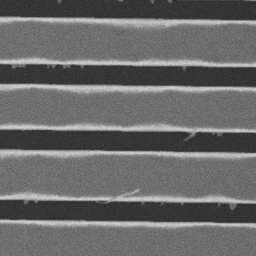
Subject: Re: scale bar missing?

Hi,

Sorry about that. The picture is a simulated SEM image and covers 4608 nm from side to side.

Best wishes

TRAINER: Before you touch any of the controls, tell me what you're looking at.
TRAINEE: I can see lines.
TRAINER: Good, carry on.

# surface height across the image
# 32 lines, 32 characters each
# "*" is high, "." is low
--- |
................................
................................
***************************.....
********************************
********************************
********************************
********************************
********************************
................................
................................
................................
********************************
********************************
********************************
********************************
********************************
.......................**.......
................................
................................
********************************
********************************
********************************
********************************
********************************
********************************
................................
................................
................................
********************************
********************************
********************************
********************************